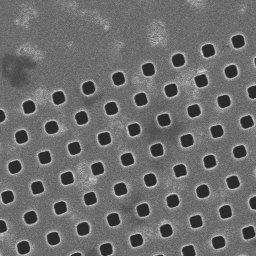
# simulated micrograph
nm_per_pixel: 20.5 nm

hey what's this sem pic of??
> a regular array of holes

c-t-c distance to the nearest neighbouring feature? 628 nanometres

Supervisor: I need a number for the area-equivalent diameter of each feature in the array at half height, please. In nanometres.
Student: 274